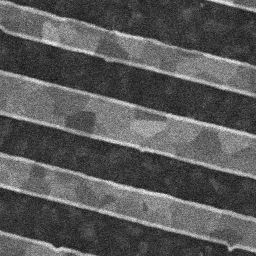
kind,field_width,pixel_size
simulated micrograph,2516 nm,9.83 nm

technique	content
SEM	one or a few lines or trenches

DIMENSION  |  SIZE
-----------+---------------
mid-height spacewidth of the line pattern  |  40.7 pixels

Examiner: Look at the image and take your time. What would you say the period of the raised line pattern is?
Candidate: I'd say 74.5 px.